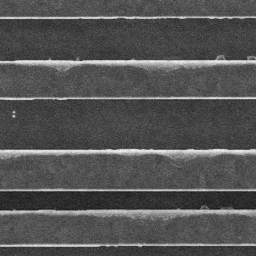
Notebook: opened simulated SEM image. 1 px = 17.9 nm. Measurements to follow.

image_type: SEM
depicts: lines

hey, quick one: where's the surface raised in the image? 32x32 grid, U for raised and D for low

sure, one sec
UUUUUUUUUUUUUUUUUUUUUUUUUUUUUUUU
UUUUUUUUUUUUUUUUUUUUUUUUUUUUUUUU
DDDDDDDDDDDDDDDDDDDDDDDDDDDDDDDD
DDDDDDDDDDDDDDDDDDDDDDDDDDDDDDDD
DDDDDDDDDDDDDDDDDDDDDDDDDDDDDDDD
DDDDDDDDDDDDDDDDDDDDDDDDDDDDDDDD
DDDDDDDDDDDDDDDDDDDDDDDDDDDDDDDD
DDDDDDDDDDDDDDDDDDDDDDDDDDDDDDDD
UUUUUUUUUUUUUUUUUUUUUUUUUUUUUUUU
UUUUUUUUUUUUUUUUUUUUUUUUUUUUUUUU
UUUUUUUUUUUUUUUUUUUUUUUUUUUUUUUU
UUUUUUUUUUUUUUUUUUUUUUUUUUUUUUUU
DDDDDDDDDDDDDDDDDDDDDDDDDDDDDDDD
DDDDDDDDDDDDDDDDDDDDDDDDDDDDDDDD
DDDDDDDDDDDDDDDDDDDDDDDDDDDDDDDD
DDDDDDDDDDDDDDDDDDDDDDDDDDDDDDDD
DDDDDDDDDDDDDDDDDDDDDDDDDDDDDDDD
DDDDDDDDDDDDDDDDDDDDDDDDDDDDDDDD
DDDDDDDDDDDDDDDDDDDDDDDDDDDDDDDD
UUUUUUUUUUUUUUUUUUUUUUUUUUUUUUUU
UUUUUUUUUUUUUUUUUUUUUUUUUUUUUUUU
UUUUUUUUUUUUUUUUUUUUUUUUUUUUUUUU
UUUUUUUUUUUUUUUUUUUUUUUUUUUUUUUU
UUUUUUUUUUUUUUUUUUUUUUUUUUUUUUUU
DDDDDDDDDDDDDDDDDDDDDDDDDDDDDDDD
DDDDDDDDDDDDDDDDDDDDDDDDDDDDDDDD
UUUUUUUUUUUUUUUUUUUUUUUUUUUUUUUU
UUUUUUUUUUUUUUUUUUUUUUUUUUUUUUUU
UUUUUUUUUUUUUUUUUUUUUUUUUUUUUUUU
UUUUUUUUUUUUUUUUUUUUUUUUUUUUUUUU
UUUUUUUUUUUUUUUUUUUUUUUUUUUUUUUU
DDDDDDDDDDDDDDDDDDDDDDDDDDDDDDDD